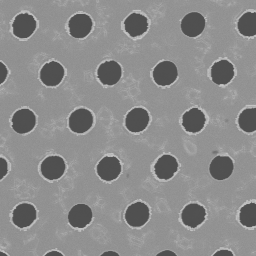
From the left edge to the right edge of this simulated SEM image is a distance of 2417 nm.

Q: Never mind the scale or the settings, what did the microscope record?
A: a regular array of holes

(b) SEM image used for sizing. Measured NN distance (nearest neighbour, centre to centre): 516 nanometres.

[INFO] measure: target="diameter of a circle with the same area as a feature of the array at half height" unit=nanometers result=228